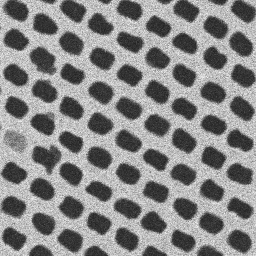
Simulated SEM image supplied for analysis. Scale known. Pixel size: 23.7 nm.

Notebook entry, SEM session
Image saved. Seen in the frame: a regular array of holes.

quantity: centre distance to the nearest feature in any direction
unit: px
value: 31.6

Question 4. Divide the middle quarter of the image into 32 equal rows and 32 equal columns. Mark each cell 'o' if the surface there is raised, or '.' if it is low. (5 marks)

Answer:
..oooooo....ooo..ooooo....oo..oo
....oooooo.ooo.....oooooooo.....
.....oooooooo.......ooooooo.....
.....oooooooo......oooooooo.....
o...oooo..ooooo....oo...oooo....
oooooo......ooooo.ooo....ooooo..
oooooo......oooooooo......oooooo
oooooo......oooooooo......oooooo
..ooooo.....oo..ooooo.....oo..oo
....ooooo..oo.....ooooo...o.....
....ooooooooo......oooooooo.....
.....oooooooo.......ooooooo.....
.....oo...oooo.....ooo.ooooo....
oo..ooo....ooooo..ooo....ooooo..
oooooo......oooooooo......oooooo
oooooo......oooooooo.......ooooo
ooooooo.....oo..ooooo.....oo..oo
..ooooooo..oo....oooooo..oo....o
....ooooooooo......oooooooo.....
.....oooooooo......oooooooo.....
.....oooooooo......ooooooooo....
o...oo....ooooo....oo..oooooo...
oooooo......oooooooo.....ooooooo
oooooo......oooooooo......oooooo
oooooo......oooooooo......oooooo
...ooooo...ooo...ooooo...ooo...o
....ooooooooo......oooo..oo.....
.....oooooooo......oooooooo.....
.....ooooooooo.....oooooooo.....
o...ooo..oooooo...ooo..oooooo...
oooooo.....ooooooooo.....ooooooo
ooooo.......oooooooo......oooooo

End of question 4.